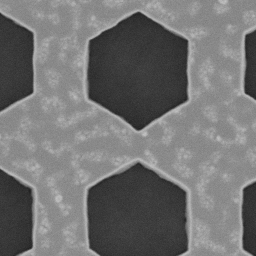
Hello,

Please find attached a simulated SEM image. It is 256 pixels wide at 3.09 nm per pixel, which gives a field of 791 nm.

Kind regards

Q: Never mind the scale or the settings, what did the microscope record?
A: holes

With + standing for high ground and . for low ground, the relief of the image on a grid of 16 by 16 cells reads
++++++++++++++++
.++++++...++++++
..++++......+++.
..+++.......+++.
..+++.......+++.
..+++.......+++.
.+++++.....+++++
++++++++..++++++
++++++++++++++++
++++++++++++++++
++++++++.+++++++
..++++.....+++++
..+++.......+++.
..+++.......+++.
..+++.......+++.
..++++......+++.